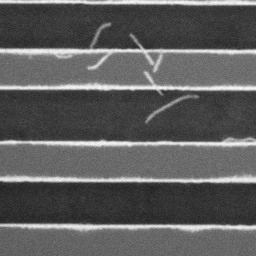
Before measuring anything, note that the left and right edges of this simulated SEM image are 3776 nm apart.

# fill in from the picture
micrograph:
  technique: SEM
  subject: lines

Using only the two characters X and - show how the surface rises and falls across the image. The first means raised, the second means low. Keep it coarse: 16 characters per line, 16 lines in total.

----------------
----------------
----------------
XXXXXXXXXXXXXXXX
XXXXXXXXXXXXXXXX
XXXXXXXXXXXXXXXX
----------------
----------------
----------------
XXXXXXXXXXXXXXXX
XXXXXXXXXXXXXXXX
----------------
----------------
----------------
XXXXXXXXXXXXXXXX
XXXXXXXXXXXXXXXX